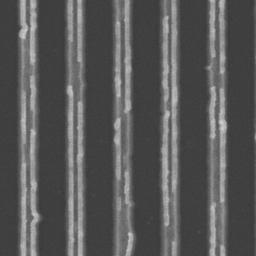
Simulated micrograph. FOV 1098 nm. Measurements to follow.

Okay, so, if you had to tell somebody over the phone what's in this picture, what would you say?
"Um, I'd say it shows parallel lines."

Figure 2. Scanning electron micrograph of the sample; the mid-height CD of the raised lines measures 16.4 px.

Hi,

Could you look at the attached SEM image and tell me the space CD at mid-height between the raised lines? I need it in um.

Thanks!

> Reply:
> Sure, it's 0.134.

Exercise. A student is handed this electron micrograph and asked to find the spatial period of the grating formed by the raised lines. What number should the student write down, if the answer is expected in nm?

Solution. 203